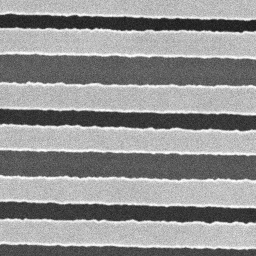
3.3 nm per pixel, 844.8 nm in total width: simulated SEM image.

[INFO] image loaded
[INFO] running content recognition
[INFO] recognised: lines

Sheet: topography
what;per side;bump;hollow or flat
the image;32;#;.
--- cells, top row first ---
################################
################################
..............................##
..#.............................
################################
################################
################################
................................
................................
................................
########...##...................
################################
################################
################################
................................
................................
################################
################################
################################
................................
................................
................................
#####################..######.#.
################################
################################
.............###################
................................
####.#..........................
################################
################################
################################
................................